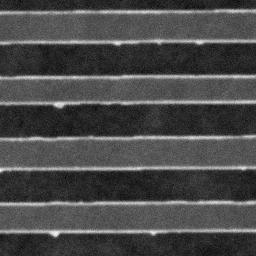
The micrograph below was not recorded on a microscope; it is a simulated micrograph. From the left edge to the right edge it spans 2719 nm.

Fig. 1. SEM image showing lines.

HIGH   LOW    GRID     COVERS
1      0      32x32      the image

00000000000000000000000000000000
00000000011011111111111111111111
11111111111111111111111111111111
11111111111111111111111111111111
11111111111111111111111111111111
00000000000000000000000000000000
00000000000000000000000000000000
00000000000000000000000000000000
00000000000000000000000000000000
00000000000000000000000000000000
11111111111111111111111111111111
11111111111111111111111111111111
11111111111111111111111111111111
00000000000000000000000000000000
00000000000000000000000000000000
00000000000000000000000000000000
00000000000000000000000000000000
11111111111111111111111111111111
11111111111111111111111111111111
11111111111111111111111111111111
11111111111111111111111111111111
00000000000000000000000000000000
00000000000000000000000000000000
00000000000000000000000000000000
00000000000000000000000000000000
11111111111111111111111111111111
11111111111111111111111111111111
11111111111111111111111111111111
11111111111111111111111111111111
00000000000000000000000000000000
00000000000000000000000000000000
00000000000000000000000000000000